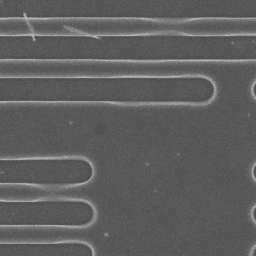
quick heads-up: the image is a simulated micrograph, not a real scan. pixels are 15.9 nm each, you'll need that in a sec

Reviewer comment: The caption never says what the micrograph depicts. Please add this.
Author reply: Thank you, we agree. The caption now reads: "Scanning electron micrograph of groups of lines, slits or small figures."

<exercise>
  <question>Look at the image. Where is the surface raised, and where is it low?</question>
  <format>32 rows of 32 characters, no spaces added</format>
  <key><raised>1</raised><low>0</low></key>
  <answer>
00000000000000000000000000000000
00000000000000000000000000000000
11111111111111111110000111111111
11111111111111111111111111111111
00001000000110000000000000000000
00000000000000000000000000000000
00000000000000000000000000000000
11111111111110000000000000000001
11111111111111111111111111111111
11111111111111111111110001111111
00000000000000000000000000011111
00000000000000000000000000011111
00000000000000000000000000111111
11111111111111111111111111111111
11111111111111111111111111111111
11111111111111111111111111111111
11111111111111111111111111111111
11111111111111111111111111111111
11111111111111111111111111111111
11111111111111111111111111111111
00000000000111111111111111111111
00000000000011111111111111111111
00000000000111111111111111111111
11111111111111111111111111111111
11111111111111111111111111111111
00000000000111111111111111111111
00000000000011111111111111111111
00000000000011111111111111111111
11111111111111111111111111111111
11111111111111111111111111111111
00000000000111111111111111111111
00000000000011111111111111111111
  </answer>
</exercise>